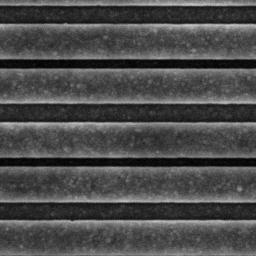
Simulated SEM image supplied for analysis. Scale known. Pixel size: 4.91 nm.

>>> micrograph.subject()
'parallel lines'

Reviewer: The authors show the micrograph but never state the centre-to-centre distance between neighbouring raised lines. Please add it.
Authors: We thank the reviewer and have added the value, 235 nm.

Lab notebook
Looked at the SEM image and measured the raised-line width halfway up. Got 173 nm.